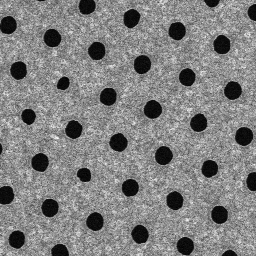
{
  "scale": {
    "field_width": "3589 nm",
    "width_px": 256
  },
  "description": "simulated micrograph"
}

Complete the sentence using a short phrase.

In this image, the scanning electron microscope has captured a regular array of holes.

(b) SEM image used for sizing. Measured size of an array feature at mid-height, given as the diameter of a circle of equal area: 249 nanometers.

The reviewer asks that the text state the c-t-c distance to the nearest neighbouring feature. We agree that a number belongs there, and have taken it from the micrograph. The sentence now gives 651 nm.